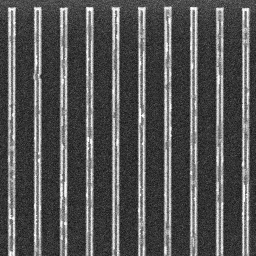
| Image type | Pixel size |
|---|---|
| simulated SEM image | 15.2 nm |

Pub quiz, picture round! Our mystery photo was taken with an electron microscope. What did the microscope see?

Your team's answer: parallel lines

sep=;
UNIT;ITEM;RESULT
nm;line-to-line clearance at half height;298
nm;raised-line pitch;395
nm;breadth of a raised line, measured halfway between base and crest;89.4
